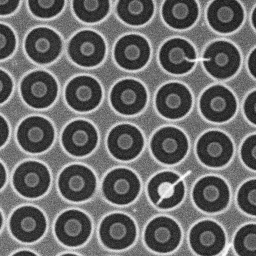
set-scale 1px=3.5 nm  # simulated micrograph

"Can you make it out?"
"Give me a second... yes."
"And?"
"an array of small figures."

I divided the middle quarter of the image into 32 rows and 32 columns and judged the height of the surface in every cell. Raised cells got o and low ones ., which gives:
oooo....oooooo......oooo........
oooooooooooooooo..ooooooo.......
ooooooooooooooooooooooooooo...oo
oo.....ooooooooooooooooooooooooo
o........oooo......oooooooo..ooo
.........ooo........oooo......oo
....oo....oo.........ooo.......o
...oooo...o....ooo...oo.........
....oo....o...oooo...oo...ooo...
o........ooo...oo....oo...ooo...
o.......oooo.........oo...oo....
oo.....oooooo.......ooo.........
ooooooooooooooo...oooooo.......o
ooooooooooooooooooooooooo....ooo
oo....oooooooooooooooooooooooooo
........ooooo....oooooooo..ooooo
........oooo.......oooo......ooo
...oo...ooo.........oo........oo
..oooo...oo...ooo...oo.........o
...ooo...oo...ooo...o....ooo...o
........ooo...ooo...o....ooo...o
.......oooo.........oo...ooo...o
o.....oooooo.......ooo.........o
ooooooooooooo.....ooooo.......oo
oooooooooooooooooooooooo.....ooo
o....ooooooooooooooooooooooooooo
.......ooooo.....ooooooooooooooo
........ooo.......ooooo.....oooo
..oo....oo.........ooo.......ooo
..ooo...oo...ooo...oo.........oo
..ooo...o....ooo...oo...ooo...oo
........o....ooo...oo...ooo...oo